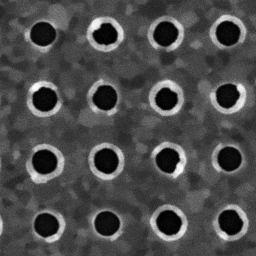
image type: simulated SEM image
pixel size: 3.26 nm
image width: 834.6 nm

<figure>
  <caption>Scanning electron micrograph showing a regular array of holes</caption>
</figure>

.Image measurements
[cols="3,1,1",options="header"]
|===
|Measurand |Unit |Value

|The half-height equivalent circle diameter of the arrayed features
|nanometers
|83.2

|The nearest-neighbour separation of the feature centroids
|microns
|0.2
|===